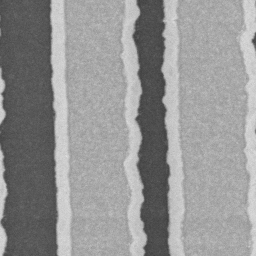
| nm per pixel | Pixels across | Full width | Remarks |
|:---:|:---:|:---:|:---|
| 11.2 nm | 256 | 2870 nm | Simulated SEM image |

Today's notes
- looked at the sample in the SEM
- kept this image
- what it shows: one or a few lines or trenches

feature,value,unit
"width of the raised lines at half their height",839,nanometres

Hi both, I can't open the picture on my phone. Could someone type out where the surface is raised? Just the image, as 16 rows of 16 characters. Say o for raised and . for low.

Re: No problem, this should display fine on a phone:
....oooo...ooooo
....oooo...ooooo
....oooo...oooo.
....oooo...ooooo
....oooo...ooooo
....oooo...ooooo
....oooo...ooooo
....oooo...ooooo
....oooo...ooooo
....oooo...ooooo
....oooo...ooooo
....oooo...ooooo
....ooooo..ooooo
....oooo...ooooo
....ooooo..ooooo
....ooooo..ooooo